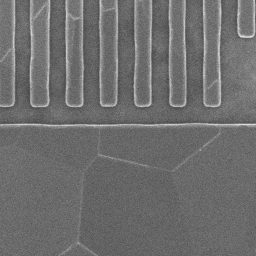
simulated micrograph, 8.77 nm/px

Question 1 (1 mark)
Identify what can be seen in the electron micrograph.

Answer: wiring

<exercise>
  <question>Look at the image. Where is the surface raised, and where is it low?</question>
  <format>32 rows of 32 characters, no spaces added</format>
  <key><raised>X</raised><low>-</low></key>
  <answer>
XX--XX--XX---XX--XX--XX---XX--XX
XX--XX--XX---XX--XX--XX---XX--XX
XX--XX--XX--XXX--XX--XX---XX--XX
XX--XX--XX--XXX--XX--XX---XX--XX
XX--XX--XX---XX--XX--XX---X---X-
XX--XX--XX---XX--XX--XX---X-----
XX--XX--XX---XX--XX--XX---X-----
XX--XX--XX---XX--XX--XX---X-----
XX--XX--XX---XX--XX--XX---X-----
XX--XX--XX---XX--XX--XX---X-----
XX--XX--XX---XX--XX--XX---XX----
XX--XX--XX---XX--XX--XX---XX----
XX--XX--XX---XX--XX--XX---XX----
--------------------------------
--------------------------------
-----------------------XXX------
XXXXXXXXXXXXXXXXXXXXXXXXXXXXXXXX
XXXXXXXXXXXXXXXXXXXXXXXXXXXXXXXX
XXXXXXXXXXXXXXXXXXXXXXXXXXXXXXXX
XXXXXXXXXXXXXXXXXXXXXXXXXXXXXXXX
XXXXXXXXXXXXXXXXXXXXXXXXXXXXXXXX
XXXXXXXXXXXXXXXXXXXXXXXXXXXXXXXX
XXXXXXXXXXXXXXXXXXXXXXXXXXXXXXXX
XXXXXXXXXXXXXXXXXXXXXXXXXXXXXXXX
XXXXXXXXXXXXXXXXXXXXXXXXXXXXXXXX
XXXXXXXXXXXXXXXXXXXXXXXXXXXXXXXX
XXXXXXXXXXXXXXXXXXXXXXXXXXXXXXXX
XXXXXXXXXXXXXXXXXXXXXXXXXXXXXXXX
XXXXXXXXXXXXXXXXXXXXXXXXXXXXXXXX
XXXXXXXXXXXXXXXXXXXXXXXXXXXXXXXX
XXXXXXXXXXXXXXXXXXXXXXXXXXXXXXXX
XXXXXXXXXXXXXXXXXXXXXXXXXXXXXXXX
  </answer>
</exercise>